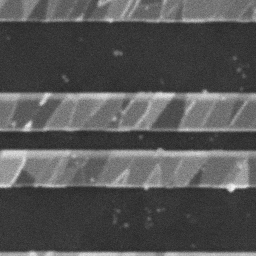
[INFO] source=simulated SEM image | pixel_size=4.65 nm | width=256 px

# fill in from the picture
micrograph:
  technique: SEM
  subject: lines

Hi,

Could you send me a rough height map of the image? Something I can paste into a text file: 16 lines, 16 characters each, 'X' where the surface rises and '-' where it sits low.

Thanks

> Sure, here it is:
XXXXXXXXXXXXXXXX
----------------
----------------
----------------
----------------
----------------
XXXXXXXXXXXXXXXX
XXXXXXXXXXXXXXXX
----------------
----------------
XXXXXXXXXXXXXXXX
XXXXXXXXXXXXXXXX
----------------
----------------
----------------
----------------